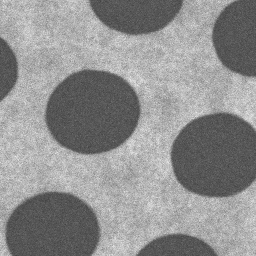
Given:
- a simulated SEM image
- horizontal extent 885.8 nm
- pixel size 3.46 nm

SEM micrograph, holes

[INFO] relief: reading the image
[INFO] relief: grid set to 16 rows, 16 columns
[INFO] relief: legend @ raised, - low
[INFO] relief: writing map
@@@@@@-----@@@--
@@@@@@@----@@---
@@@@@@@@@@@@@---
-@@@@@@@@@@@@@--
-@@@@--@@@@@@@@-
-@@@----@@@@@@@@
@@@------@@@@@@@
@@@------@@@---@
@@@-----@@@-----
@@@@@--@@@@-----
@@@@@@@@@@@-----
@@@@@@@@@@@-----
@@---@@@@@@@@@@@
@-----@@@@@@@@@@
------@@@@@@@@@@
@-----@@@----@@@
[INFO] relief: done